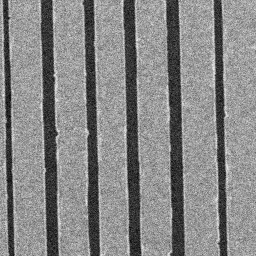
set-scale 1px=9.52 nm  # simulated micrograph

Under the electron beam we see parallel lines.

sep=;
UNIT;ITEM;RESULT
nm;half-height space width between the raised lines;118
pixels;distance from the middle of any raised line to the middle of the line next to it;42.7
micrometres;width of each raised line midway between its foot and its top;0.287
